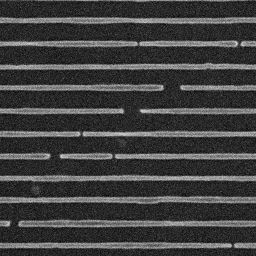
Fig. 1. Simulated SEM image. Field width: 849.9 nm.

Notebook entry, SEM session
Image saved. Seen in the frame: parallel lines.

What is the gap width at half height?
18.2 pixels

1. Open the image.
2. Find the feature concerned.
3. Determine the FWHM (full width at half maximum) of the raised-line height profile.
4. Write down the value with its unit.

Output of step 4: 16.2 nanometres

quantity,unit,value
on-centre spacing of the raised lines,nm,74.6